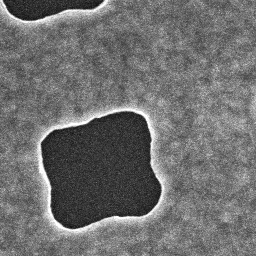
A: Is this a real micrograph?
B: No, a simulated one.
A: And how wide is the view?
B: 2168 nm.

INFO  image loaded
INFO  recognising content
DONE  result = holes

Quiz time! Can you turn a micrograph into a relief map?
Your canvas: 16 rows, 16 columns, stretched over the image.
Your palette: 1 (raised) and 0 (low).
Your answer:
0000001111111111
1111111111111111
1111111111111111
1111111111111111
1111111111111111
1111111111111111
1111111111111111
1111110001111111
1110000001111111
1110000001111111
1110000000111111
1110000000111111
1110000000111111
1110000001111111
1111111111111111
1111111111111111